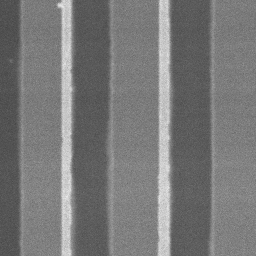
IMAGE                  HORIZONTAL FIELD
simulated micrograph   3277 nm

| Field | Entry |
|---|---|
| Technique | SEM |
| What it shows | lines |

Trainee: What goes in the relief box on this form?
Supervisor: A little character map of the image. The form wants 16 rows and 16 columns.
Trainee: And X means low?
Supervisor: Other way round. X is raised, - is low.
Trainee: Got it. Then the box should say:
-XXX---XXX---XXX
-XXX---XXXX--XXX
-XXX---XXXX--XXX
-XXX---XXXX--XXX
-XXX---XXXX--XXX
-XXX---XXXX--XXX
-XXX---XXXX--XXX
-XXX---XXXX--XXX
-XXX---XXXX--XXX
-XXX---XXXX--XXX
-XXX---XXXX--XXX
-XXX---XXXX--XXX
-XXX---XXXX--XXX
-XXX---XXXX--XXX
-XXX---XXXX--XXX
-XXX---XXXX--XXX